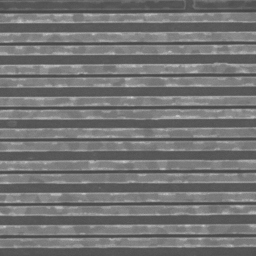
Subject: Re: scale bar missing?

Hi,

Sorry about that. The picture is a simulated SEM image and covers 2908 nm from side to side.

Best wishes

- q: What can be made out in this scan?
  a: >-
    parallel lines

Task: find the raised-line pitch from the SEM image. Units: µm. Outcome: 0.181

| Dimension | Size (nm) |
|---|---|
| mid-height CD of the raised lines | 99.4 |